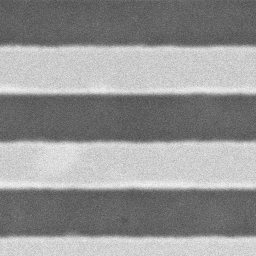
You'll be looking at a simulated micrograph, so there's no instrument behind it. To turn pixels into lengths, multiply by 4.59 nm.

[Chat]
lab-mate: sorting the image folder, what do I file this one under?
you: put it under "lines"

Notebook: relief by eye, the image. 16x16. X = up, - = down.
----------------
----------------
----------------
XXXXXXXXXXXXXXXX
XXXXXXXXXXXXXXXX
XXXXXXXXXXXXXXXX
----------------
----------------
----------------
XXXXXXXXXXXXXXXX
XXXXXXXXXXXXXXXX
XXXXXXXXXXXXXXXX
----------------
----------------
----------------
XXXXXXXXXXXXXXXX